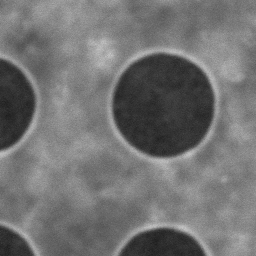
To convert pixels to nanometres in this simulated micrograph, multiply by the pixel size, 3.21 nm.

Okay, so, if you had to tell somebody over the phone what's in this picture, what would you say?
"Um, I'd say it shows holes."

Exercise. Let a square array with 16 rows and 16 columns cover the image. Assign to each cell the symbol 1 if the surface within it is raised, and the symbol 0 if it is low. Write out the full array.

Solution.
1111111111111111
1111111111111111
1111111111111111
1111111110011111
0111111100000111
0011111000000111
0011111000000111
0011111000000111
0111111100000111
1111111110001111
1111111111111111
1111111111111111
1111111111111111
1111111111111111
0111111110011111
0011111100000111